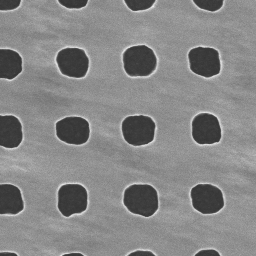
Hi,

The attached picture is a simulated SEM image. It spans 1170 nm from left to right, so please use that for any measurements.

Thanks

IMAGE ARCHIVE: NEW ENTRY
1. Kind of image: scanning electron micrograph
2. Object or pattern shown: a regular array of holes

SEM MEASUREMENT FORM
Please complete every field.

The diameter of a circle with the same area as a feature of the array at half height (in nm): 145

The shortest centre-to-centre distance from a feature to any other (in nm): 300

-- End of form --